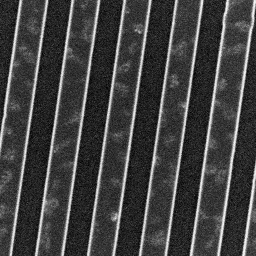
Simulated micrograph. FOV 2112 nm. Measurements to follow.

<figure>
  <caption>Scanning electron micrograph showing parallel lines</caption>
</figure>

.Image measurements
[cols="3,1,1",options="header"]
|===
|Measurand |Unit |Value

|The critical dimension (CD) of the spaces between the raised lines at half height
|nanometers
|204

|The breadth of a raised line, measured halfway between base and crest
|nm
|218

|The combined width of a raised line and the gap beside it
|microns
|0.423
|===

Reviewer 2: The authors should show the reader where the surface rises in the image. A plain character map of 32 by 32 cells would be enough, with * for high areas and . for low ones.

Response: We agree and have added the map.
...***...***...****...***...****
..****...***...****...***...****
..****...***...***....***...****
..***....***...***...****...***.
..***...****...***...****...***.
..***...****...***...****...***.
..***...***....***...***....***.
..***...***...****...***...****.
.****...***...****...***...****.
.****...***...***....***...****.
.***....***...***...****...***..
.***...****...***...****...***..
.***...****...***...****...***..
.***...***....***...***....***..
.***...***...****...***...****..
****...***...****...***...****..
****...***...***....***...****..
***....***...***...****...***...
***...****...***...****...***...
***...****...***...****...***...
***...***....***...***....***...
***...***...****...***...****...
***...***...****...***...****...
***...***...***....***...****...
**....***...***...****...***....
**...****...***...****...***...*
**...****...***...****...***...*
**...***....***...***....***...*
**...***...****...***...****...*
**...***...****...***...****...*
**...***...***....***...****...*
*....***...***...****...***....*